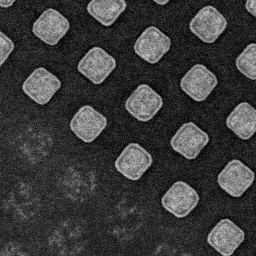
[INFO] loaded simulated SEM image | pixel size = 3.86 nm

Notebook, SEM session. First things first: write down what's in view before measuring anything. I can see a regular array of raised bodies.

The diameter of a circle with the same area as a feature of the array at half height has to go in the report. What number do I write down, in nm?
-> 127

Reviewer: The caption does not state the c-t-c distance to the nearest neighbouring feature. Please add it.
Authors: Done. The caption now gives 229 nanometers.